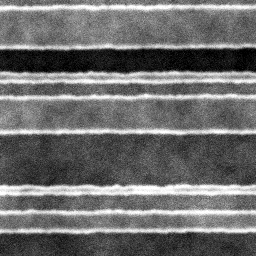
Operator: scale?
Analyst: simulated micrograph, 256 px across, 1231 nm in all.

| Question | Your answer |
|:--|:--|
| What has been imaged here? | lines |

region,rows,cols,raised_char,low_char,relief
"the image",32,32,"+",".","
++++++++++++++++++++++++++++++++
++++++++++++++++++++++++++++++++
++++++++++++++++++++++++++++++++
++++++++++++++++++++++++++++++++
++++++++++++++++++++++++++++++++
++++++++++++++++++++++++++++++++
................................
................................
................................
++++++++++++++++++++++++++++++++
++++++++++++++++++++++++++++++++
++++++++++++++++++++++++++++++++
++++++++++++++++++++++++++++++++
++++++++++++++++++++++++++++++++
++++++++++++++++++++++++++++++++
++++++++++++++++++++++++++++++++
+++++++++++.+.++.+.+++++++++++++
................................
................................
................................
................................
................................
................................
++++++++++++++++++++++++++++++++
++++++++++++++++++++++++++++++++
++++++++++++++++++++++++++++++++
++++++++++++++++++++++++++++++++
++++++++++++++++++++++++++++++++
++++++++++++++++++++++++++++++++
................................
................................
................................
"